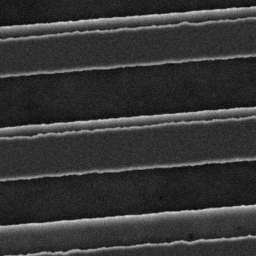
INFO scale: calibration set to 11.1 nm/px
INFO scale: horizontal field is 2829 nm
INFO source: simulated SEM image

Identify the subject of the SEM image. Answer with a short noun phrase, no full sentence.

lines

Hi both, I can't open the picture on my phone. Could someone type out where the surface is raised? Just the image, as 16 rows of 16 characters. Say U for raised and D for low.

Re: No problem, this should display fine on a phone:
DDDDDDDDDDDDDDDU
DDDUUUUUUUUUUUUU
UUUUUUUUUUUUUUUU
UUUUUUUUUUUUUUUU
UUUUDDDDDDDDDDDD
DDDDDDDDDDDDDDDD
DDDDDDDDDDDDDDDD
DDDDDDUUUUUUUUUU
UUUUUUUUUUUUUUUU
UUUUUUUUUUUUUUUU
UUUUUUUUUUDDDDDD
DDDDDDDDDDDDDDDD
DDDDDDDDDDDDDDDD
DDDDDDDDUUUUUUUU
UUUUUUUUUUUUUUUU
UUUUUUUUUUUUUUUU